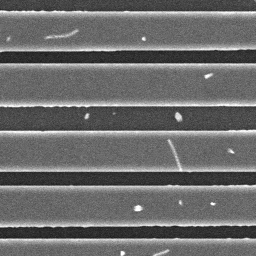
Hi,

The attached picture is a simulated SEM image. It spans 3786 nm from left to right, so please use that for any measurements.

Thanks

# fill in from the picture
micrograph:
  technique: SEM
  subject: lines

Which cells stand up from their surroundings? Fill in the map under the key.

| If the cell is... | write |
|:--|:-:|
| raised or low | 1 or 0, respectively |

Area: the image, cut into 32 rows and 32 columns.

00000000000000000000000000000000
11111111011000010000000000000000
11111111111111111111111111111111
11111111111111111111111111111111
11111111111111111111111111111111
11111111111111111111111111111111
00000000000000000000000000000000
00000000000000000000000000000000
11111111111111111111111111111111
11111111111111111111111111111111
11111111111111111111111111111111
11111111111111111111111111111111
11111111111111111111111111111111
00000000000000000000000000000000
00000000000000000000000000000000
00000000000000000000000000000000
11111111111111111111111111111111
11111111111111111111111111111111
11111111111111111111111111111111
11111111111111111111111111111111
11111111111111111111111111111111
00000000000000000000000000000000
00000000000000000000000000000000
11111111111111111111111111111111
11111111111111111111111111111111
11111111111111111111111111111111
11111111111111111111111111111111
11111111111111111111111111111111
00000000000000000000000000000000
00000000000000000000000000000000
11111111111111111111111111111111
11111111111111111111111111111111